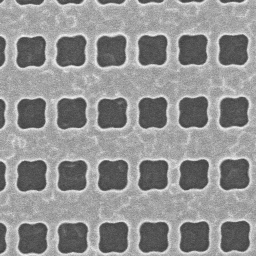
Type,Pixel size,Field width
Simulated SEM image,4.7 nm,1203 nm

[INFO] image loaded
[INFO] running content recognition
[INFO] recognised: a regular array of holes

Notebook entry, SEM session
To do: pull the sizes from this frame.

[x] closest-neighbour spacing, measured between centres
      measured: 189 nanometres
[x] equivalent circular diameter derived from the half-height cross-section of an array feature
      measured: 154 nm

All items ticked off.